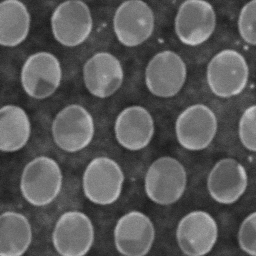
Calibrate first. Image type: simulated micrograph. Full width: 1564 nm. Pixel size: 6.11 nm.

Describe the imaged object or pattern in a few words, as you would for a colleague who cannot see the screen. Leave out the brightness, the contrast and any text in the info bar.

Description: a regular array of raised bodies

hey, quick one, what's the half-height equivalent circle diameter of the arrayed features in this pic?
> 257 nm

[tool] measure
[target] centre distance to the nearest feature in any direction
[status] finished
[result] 0.375 microns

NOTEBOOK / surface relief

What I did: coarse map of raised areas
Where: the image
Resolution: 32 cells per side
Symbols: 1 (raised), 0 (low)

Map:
11100000110000011100000111000001
11100001111000011110001111100011
11110011111000111110001111100011
11110001111000111110001111100011
11100001111000011110001111000011
11000000110000001000000010000000
00000000000000000000000000001000
00001110000111100001111000011100
00011110000111100011111000111110
00011110000111100011111000111110
00011110000111100011111000111110
00011110000111000001110000011100
00000000000000000000000000000000
11000000110000001100000011000001
11100001111000011110000111100011
11110001111000011110001111100011
11110001111000111110001111100011
11100001111000011110001111000011
11000000110000001000000010000001
00000000000000000000000000000000
00001110000111000001110000011100
00011110000111100001111000111100
00011111001111100011111000111110
00011110001111100011111000111110
00011110000111100001111000011100
00001100000000000000000000000000
00000000000000000000000000000000
11100000111000011110000111100001
11110001111100011110001111100011
11110001111100111110001111100011
11110001111000011110001111100011
11100001111000011100000111000001